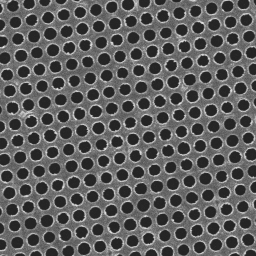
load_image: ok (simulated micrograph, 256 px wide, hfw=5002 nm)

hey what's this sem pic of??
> a regular array of holes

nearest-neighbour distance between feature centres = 316 nm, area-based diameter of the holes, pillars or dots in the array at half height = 228 nm